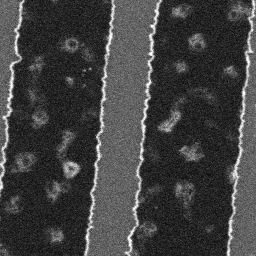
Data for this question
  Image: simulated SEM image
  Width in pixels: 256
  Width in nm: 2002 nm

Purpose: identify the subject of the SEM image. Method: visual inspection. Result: one or a few lines or trenches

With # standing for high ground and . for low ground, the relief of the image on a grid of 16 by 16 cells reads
.######...######
.######...######
.######..#######
.######..#######
.######..#######
.######..######.
.#####...######.
######...######.
######...######.
######...######.
######...######.
######...######.
######...######.
######..#######.
######..######..
#####...######..